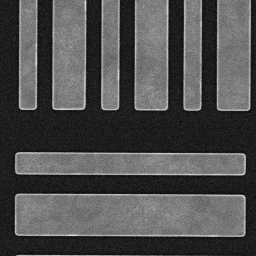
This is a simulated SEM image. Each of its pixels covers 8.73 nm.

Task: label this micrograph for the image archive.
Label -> groups of lines, slits or small figures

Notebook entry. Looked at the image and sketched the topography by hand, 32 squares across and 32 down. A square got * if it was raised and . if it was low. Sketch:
..***..****..**..****..**..****.
..***..****..**..****..**..****.
..***..****..**..****..**..****.
..***..****..**..****..**..****.
..***..****..**..****..**..****.
..***..****..**..****..**..****.
..***..****..**..****..**..****.
..***..****..**..****..**..****.
..***..****..**..****..**..****.
..***..****..**..****..**..****.
..***..****..**..****..**..****.
..***..****..**..****..**..****.
..***..****..**..****..**..****.
...*...***...**..****..**..****.
................................
................................
................................
................................
................................
..*****************************.
..*****************************.
..*****************************.
................................
................................
..****************************..
..*****************************.
..*****************************.
..*****************************.
..*****************************.
................................
................................
................................